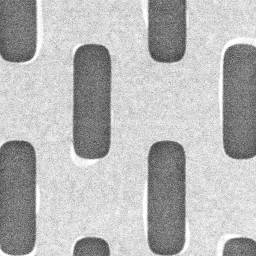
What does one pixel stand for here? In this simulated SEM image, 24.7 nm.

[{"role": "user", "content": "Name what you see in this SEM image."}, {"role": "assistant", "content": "groups of lines, slits or small figures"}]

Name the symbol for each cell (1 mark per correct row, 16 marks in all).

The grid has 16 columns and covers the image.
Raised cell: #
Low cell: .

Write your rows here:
..#######...####
...######...####
...######...####
..###..##..###..
#####..#######..
#####..#######..
#####..#######..
####...#######..
####...#######..
..###..##...##..
..#######...####
..#######...####
..#######...####
..#######...####
..#######...####
..###..##..###..